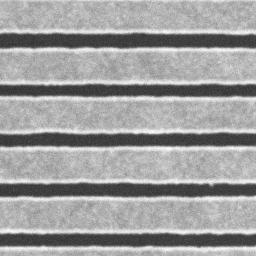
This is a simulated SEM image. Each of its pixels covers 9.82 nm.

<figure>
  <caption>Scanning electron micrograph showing lines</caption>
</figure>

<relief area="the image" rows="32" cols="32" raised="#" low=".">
################################
################################
################################
################################
................................
................................
################################
################################
################################
################################
................................
................................
################################
################################
################################
################################
#####...##############.###.....#
................................
..................#...........##
################################
################################
################################
################################
................................
................................
################################
################################
################################
################################
................................
................................
################################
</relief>